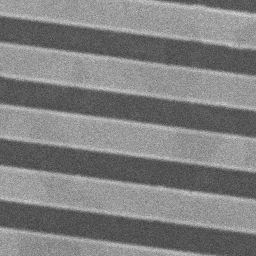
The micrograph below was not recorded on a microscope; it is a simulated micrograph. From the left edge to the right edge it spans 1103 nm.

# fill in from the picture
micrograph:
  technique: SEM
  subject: parallel lines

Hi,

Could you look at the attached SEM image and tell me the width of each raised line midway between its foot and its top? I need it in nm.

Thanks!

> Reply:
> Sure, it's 132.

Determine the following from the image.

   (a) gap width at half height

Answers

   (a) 131 nm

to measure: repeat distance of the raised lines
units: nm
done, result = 263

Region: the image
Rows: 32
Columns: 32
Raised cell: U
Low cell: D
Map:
UUUUUUUUUUUUUUUUUUUUUDDDDDDDDDDD
UUUUUUUUUUUUUUUUUUUUUUUUUUUUUDDD
DDDDDDUUUUUUUUUUUUUUUUUUUUUUUUUU
DDDDDDDDDDDDDUUUUUUUUUUUUUUUUUUU
DDDDDDDDDDDDDDDDDDDDDUUUUUUUUUUU
DDDDDDDDDDDDDDDDDDDDDDDDDDDDUUUU
UUUUUUUDDDDDDDDDDDDDDDDDDDDDDDDD
UUUUUUUUUUUUUUUDDDDDDDDDDDDDDDDD
UUUUUUUUUUUUUUUUUUUUUUUDDDDDDDDD
DUUUUUUUUUUUUUUUUUUUUUUUUUUUUUDD
DDDDDDDDUUUUUUUUUUUUUUUUUUUUUUUU
DDDDDDDDDDDDDDDDUUUUUUUUUUUUUUUU
DDDDDDDDDDDDDDDDDDDDDDDUUUUUUUUU
UUDDDDDDDDDDDDDDDDDDDDDDDDDDDDDU
UUUUUUUUUUDDDDDDDDDDDDDDDDDDDDDD
UUUUUUUUUUUUUUUUUDDDDDDDDDDDDDDD
UUUUUUUUUUUUUUUUUUUUUUUUUDDDDDDD
DDDUUUUUUUUUUUUUUUUUUUUUUUUUUUUU
DDDDDDDDDDDUUUUUUUUUUUUUUUUUUUUU
DDDDDDDDDDDDDDDDDDUUUUUUUUUUUUUU
DDDDDDDDDDDDDDDDDDDDDDDDDDUUUUUU
UUUUDDDDDDDDDDDDDDDDDDDDDDDDDDDD
UUUUUUUUUUUUDDDDDDDDDDDDDDDDDDDD
UUUUUUUUUUUUUUUUUUUDDDDDDDDDDDDD
UUUUUUUUUUUUUUUUUUUUUUUUUUUDDDDD
DDDDDUUUUUUUUUUUUUUUUUUUUUUUUUUU
DDDDDDDDDDDDDUUUUUUUUUUUUUUUUUUU
DDDDDDDDDDDDDDDDDDDDDUUUUUUUUUUU
DDDDDDDDDDDDDDDDDDDDDDDDDDDDUUUU
UUUUUUUDDDDDDDDDDDDDDDDDDDDDDDDD
UUUUUUUUUUUUUUDDDDDDDDDDDDDDDDDD
UUUUUUUUUUUUUUUUUUUUUUDDDDDDDDDD